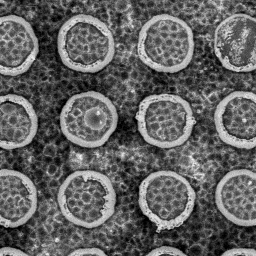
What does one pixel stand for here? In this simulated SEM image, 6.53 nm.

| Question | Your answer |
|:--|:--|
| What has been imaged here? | raised bodies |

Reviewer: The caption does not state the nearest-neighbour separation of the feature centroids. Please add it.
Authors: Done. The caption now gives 496 nanometres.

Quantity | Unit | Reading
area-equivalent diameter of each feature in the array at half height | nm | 345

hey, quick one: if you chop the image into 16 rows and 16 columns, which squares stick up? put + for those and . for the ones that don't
................
++..++...++....+
++..+++..+++..++
++..+++..+++..++
+...............
................
++..+++..++...++
++..+++..+++..++
++..+++..+++..++
................
................
++..+++..+++..++
++..+++..+++..++
++..+++..+++..++
................
................